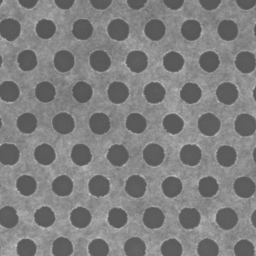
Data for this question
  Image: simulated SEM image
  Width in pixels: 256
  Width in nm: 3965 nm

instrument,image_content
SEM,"a regular array of holes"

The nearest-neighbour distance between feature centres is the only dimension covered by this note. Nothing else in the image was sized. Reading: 0.556 µm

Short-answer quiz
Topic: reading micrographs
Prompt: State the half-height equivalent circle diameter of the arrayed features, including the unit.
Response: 334 nm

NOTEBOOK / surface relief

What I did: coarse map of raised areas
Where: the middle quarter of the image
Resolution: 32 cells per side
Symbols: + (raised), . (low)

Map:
...++++....+++++.....++++.....++
..++++++...++++++...+++++....+++
++++++++++++++++++++++++++++++++
++++++++++++++++++++++++++++++++
+++..+++++++..++++++++++++++++++
++.....++++.....++++.....+++++..
++.....++++.....++++.....++++...
++.....++++.....++++.....++++...
++.....++++.....++++.....++++...
++++.+++++++...++++++...++++++..
++++++++++++++++++++++++++++++++
++++++++++++++++++++++++++++++++
.++++++...++++++...+++++++..++++
..+++++....+++++....+++++....+++
..++++......+++......++++.....++
...+++......+++......++++.....++
..+++++....+++++....+++++....+++
++++++++..++++++++.++++++++.++++
++++++++++++++++++++++++++++++++
++++++++++++++++++++++++++++++++
++....++++++...++++++...++++++..
++.....++++.....++++.....++++...
++.....++++.....++++.....++++...
++.....++++.....++++.....++++...
++....+++++.....++++.....++++...
++++.++++++++.++++++++.+++++++++
++++++++++++++++++++++++++++++++
++++++++++++++++++++++++++++++++
..+++++....+++++....++++++...+++
..++++.....+++++....+++++....+++
..++++.....++++......+++......++
..++++.....++++.....+++++....+++